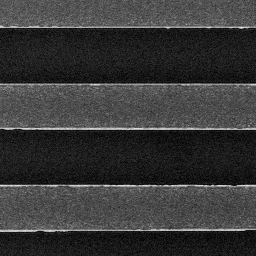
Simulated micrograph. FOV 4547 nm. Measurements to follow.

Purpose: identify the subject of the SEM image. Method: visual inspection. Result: lines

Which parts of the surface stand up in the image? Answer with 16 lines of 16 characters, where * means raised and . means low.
****************
****************
................
................
................
****************
****************
****************
................
................
................
................
****************
****************
................
................